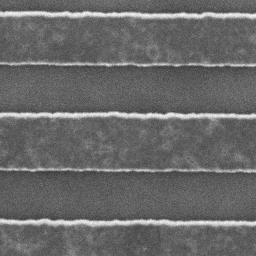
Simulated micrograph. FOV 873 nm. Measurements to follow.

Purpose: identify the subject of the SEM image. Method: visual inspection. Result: lines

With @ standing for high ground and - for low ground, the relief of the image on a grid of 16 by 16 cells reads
----------------
@@@@@@@@@@@@@@@@
@@@@@@@@@@@@@@@@
@@@@@@@@@@@@@@@@
----------------
----------------
----------------
@@@@@@@@@@@@@@@@
@@@@@@@@@@@@@@@@
@@@@@@@@@@@@@@@@
@@@@@@@@@@@@@@@@
----------------
----------------
----------------
@@@@@@@@@@@@@@@@
@@@@@@@@@@@@@@@@